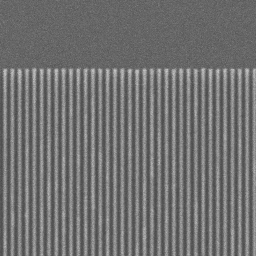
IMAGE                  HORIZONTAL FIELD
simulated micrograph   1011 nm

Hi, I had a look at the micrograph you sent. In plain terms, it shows parallel lines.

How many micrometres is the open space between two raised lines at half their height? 0.0182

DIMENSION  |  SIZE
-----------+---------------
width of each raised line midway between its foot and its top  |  11.3 nm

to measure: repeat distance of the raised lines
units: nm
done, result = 29